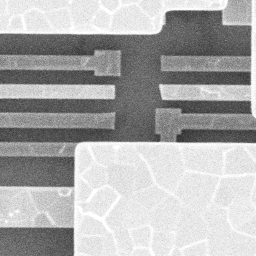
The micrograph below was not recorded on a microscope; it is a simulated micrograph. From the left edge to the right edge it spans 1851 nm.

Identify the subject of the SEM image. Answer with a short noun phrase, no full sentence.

wiring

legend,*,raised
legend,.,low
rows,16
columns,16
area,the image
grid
**************..
**********......
................
................
................
................
................
................
................
.....***********
.....***********
.....***********
.....***********
.....***********
.....***********
.....***********